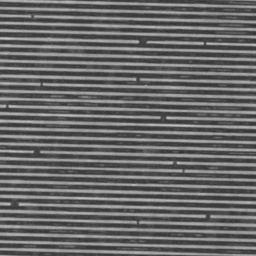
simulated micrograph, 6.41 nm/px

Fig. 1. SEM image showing parallel lines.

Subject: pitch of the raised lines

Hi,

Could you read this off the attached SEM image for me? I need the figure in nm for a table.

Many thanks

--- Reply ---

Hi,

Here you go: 48.3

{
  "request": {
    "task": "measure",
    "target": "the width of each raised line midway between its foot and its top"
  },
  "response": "16 nanometers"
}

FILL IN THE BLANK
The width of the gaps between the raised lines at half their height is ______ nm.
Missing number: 32.8